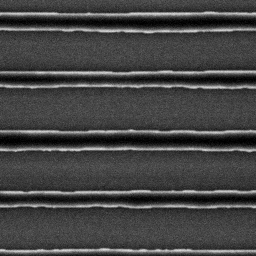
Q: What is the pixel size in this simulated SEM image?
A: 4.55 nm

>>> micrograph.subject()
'lines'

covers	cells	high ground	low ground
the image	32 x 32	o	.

................................
................................
oooooooooooooooooooooooooooooooo
oooooooooooooooooooooooooooooooo
................................
................................
................................
................................
................................
oooooooooooooooooooooooooooooooo
oooooooooooooooooooooooooooooooo
................................
................................
................................
................................
................................
oooooooooooooooooooooooooooooooo
oooooooooooooooooooooooooooooooo
oooooooooooooooooooooooooooooooo
................................
................................
................................
................................
................................
oooooooooooooooooooooooooooooooo
oooooooooooooooooooooooooooooooo
................................
................................
................................
................................
................................
oooooooooooooooooooooooooooooooo